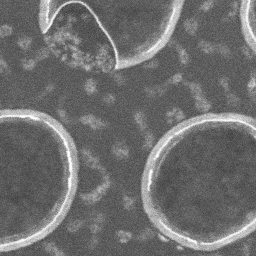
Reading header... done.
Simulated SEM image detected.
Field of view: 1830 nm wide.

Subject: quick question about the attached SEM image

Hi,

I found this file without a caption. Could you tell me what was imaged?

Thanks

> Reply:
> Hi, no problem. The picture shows raised bodies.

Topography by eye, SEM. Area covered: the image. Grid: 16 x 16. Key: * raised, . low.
...*.******....*
......*****....*
.......***......
.......**.......
................
................
................
***.........***.
****.......*****
****......******
*****....*******
****.....*******
****.....*******
****......******
***........****.
................